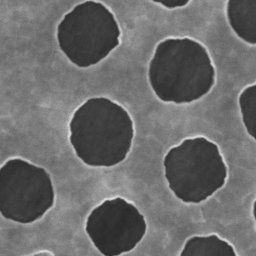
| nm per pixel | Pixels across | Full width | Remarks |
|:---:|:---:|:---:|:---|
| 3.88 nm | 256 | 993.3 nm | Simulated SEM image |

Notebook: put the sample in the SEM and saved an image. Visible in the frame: holes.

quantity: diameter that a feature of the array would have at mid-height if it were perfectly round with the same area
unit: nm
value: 245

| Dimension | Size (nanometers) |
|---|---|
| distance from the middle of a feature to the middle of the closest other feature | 387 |